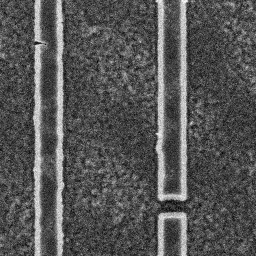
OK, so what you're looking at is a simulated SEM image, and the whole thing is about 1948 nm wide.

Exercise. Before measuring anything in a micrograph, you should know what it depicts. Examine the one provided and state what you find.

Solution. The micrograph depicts one or a few lines or trenches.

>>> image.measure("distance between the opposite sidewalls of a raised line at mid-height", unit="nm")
181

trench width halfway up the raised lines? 0.757 um